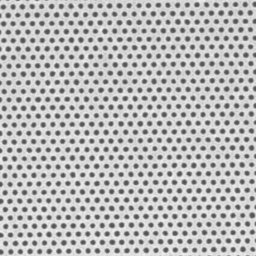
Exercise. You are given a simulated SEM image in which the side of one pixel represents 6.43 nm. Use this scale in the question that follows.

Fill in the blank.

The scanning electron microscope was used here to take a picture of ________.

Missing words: a regular array of holes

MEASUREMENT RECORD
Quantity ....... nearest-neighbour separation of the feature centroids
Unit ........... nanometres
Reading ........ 60.6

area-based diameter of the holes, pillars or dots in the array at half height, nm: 35.5